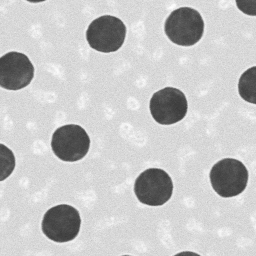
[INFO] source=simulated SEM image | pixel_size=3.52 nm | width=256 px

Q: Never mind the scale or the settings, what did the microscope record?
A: holes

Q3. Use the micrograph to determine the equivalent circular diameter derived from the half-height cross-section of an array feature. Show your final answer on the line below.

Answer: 0.136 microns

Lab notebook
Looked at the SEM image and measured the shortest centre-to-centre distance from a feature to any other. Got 276 nanometers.